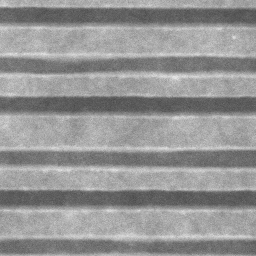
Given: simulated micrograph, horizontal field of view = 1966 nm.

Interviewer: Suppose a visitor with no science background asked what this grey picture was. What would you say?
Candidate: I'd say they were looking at lines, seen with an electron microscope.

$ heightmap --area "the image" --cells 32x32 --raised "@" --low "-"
@@@@@@@@@@@@@@@@@@@@@@@@@@@@@@@@
--------------------------------
--------------------------------
@@@@@@@@@@@@@@@@@@--@@@-@@------
@@@@@@@@@@@@@@@@@@@@@@@@@@@@@@@@
@@@@@@@@@@@@@@@@@@@@@@@@@@@@@@@@
@@@@@@@@@@@@@@@@@@@@@@@@@@@@@@@@
--------------------------------
--------------------------------
@@@@@@--@@@@@@@@@@@@@@@@@@@@@@@@
@@@@@@@@@@@@@@@@@@@@@@@@@@@@@@@@
@@@@@@@@@@@@@@@@@@@@@@@@@@@@@@@@
--------------------------------
--------------------------------
@@@@------@---------------------
@@@@@@@@@@@@@@@@@@@@@@@@@@@@@@@@
@@@@@@@@@@@@@@@@@@@@@@@@@@@@@@@@
@@@@@@@@@@@@@@@@@@@@@@@@@@@@@@@@
@@@@@@@@@@@@@@@@@@@@@@@@@@@@@@@@
--------------------------------
--------------------------------
@@@@@@@@@@@@@@@@@@@@@@@@@@@@@@@@
@@@@@@@@@@@@@@@@@@@@@@@@@@@@@@@@
@@@@@@@@@@@@@@@@@@@@@@@@@@@@@@@@
--------------------------------
--------------------------------
@@@@@@@@@@@@@@@@@@@@@@@@@@@@@@@@
@@@@@@@@@@@@@@@@@@@@@@@@@@@@@@@@
@@@@@@@@@@@@@@@@@@@@@@@@@@@@@@@@
@@@@@@@@@@@@@@@@@@@@@@@@@@@@@@@@
--------------------------------
--------------------------------